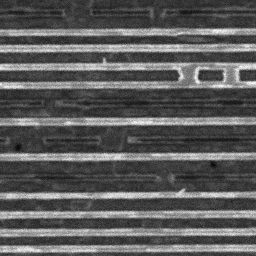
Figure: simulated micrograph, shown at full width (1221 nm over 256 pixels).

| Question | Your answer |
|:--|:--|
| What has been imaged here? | parallel lines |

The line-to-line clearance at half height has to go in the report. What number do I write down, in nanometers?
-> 60.2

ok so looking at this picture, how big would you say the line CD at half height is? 29.8 nm